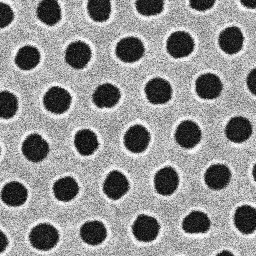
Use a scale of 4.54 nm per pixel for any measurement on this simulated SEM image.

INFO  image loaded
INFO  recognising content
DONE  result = a regular array of holes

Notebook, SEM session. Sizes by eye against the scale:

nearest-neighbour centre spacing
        229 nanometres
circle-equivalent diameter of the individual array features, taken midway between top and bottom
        26.6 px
